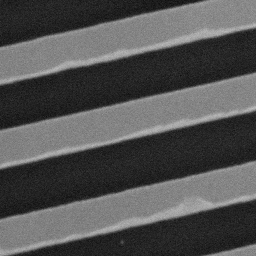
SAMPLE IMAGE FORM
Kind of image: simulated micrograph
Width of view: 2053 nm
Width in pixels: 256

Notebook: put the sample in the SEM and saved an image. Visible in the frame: lines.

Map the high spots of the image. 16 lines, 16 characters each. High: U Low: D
DDDDDDDDDDDUUUUU
DDDDDDUUUUUUUUUU
DDUUUUUUUUUUDDDD
UUUUUUUUDDDDDDDD
UUUDDDDDDDDDDDDD
DDDDDDDDDDDDUUUU
DDDDDDDUUUUUUUUU
DDDUUUUUUUUUUDDD
UUUUUUUUUDDDDDDD
UUUUDDDDDDDDDDDD
DDDDDDDDDDDDDDUU
DDDDDDDDDDUUUUUU
DDDDDUUUUUUUUUUD
DUUUUUUUUUUDDDDD
UUUUUUUDDDDDDDDD
UUDDDDDDDDDDDDDU